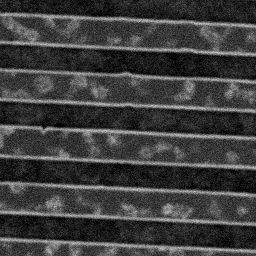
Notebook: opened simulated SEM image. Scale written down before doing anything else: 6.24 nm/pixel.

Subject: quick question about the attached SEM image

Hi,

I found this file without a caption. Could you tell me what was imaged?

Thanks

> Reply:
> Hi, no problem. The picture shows parallel lines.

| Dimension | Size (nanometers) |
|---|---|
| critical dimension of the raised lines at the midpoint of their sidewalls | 189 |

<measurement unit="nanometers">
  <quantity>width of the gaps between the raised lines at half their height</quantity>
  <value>161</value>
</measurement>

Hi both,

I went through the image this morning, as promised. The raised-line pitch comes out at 352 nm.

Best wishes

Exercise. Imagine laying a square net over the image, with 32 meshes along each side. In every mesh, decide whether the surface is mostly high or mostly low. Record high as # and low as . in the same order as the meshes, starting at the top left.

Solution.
................................
................................
#################...............
################################
################################
....############################
.........................#######
................................
................................
#################...............
################################
################################
.###############################
.......................#########
................................
................................
################................
################################
################################
################################
.....................###########
................................
................................
##############..................
################################
################################
################################
....................############
................................
................................
##############..................
################################